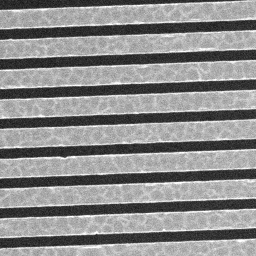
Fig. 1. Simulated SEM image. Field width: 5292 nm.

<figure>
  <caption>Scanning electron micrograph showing parallel lines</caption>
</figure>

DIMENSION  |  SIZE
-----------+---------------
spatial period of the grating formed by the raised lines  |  0.615 microns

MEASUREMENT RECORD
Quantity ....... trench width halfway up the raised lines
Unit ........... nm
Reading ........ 369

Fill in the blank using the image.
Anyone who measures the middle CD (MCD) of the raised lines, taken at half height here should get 0.248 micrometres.